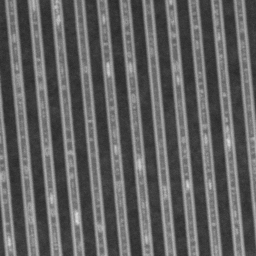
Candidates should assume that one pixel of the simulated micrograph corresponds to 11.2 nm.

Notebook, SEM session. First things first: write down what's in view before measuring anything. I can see parallel lines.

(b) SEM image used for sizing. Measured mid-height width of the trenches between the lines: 164 nm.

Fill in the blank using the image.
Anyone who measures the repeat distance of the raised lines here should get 256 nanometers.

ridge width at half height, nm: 97.9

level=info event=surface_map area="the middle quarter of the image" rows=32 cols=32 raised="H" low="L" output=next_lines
LLLLHHLLLLHHLLLLHHLLLHHLLLLHHLLL
HLLLHHLLLLHHLLLLHHLLLHHLLLLHHLLL
HLLLLHLLLLHHLLLLHHLLLHHLLLLHHLLL
HLLLLHLLLLHHLLLLHHLLLLHHLLLHHLLL
HLLLLHHLLLHHLLLLHHLLLLHHLLLLHHLL
HLLLLHHLLLHHLLLLHHLLLLHHLLLLHHLL
HLLLLHHLLLLHHLLLHHLLLLHHLLLLHHLL
HLLLLHHLLLLHHLLLHHLLLLHHLLLLHHLL
HLLLLHHLLLLHHLLLHHLLLLHHLLLLHHLL
HLLLLHHLLLLHHLLLHHLLLLHHLLLLHHLL
HLLLLHHLLLLHHLLLLHHLLLHHLLLLHHLL
HLLLLHHLLLLHHLLLLHHLLLLHLLLLHHLL
HHLLLHHLLLLHHLLLLHHLLLHHLLLLHHLL
HHLLLLHHLLLHHLLLLHHLLLHHLLLLHHLL
HHLLLLHHLLLHHLLLLHHLLLLHHLLLHHLL
HHLLLLHHLLLHHLLLLHHLLLLHHLLLLHHL
HHLLLLHHLLLHHLLLLHHLLLLHHLLLLHHL
HHLLLLHHLLLLHHLLLHHLLLLHHLLLLHHL
HHLLLLHHLLLLHHLLLHHLLLLHHLLLLHHL
HHLLLLHHLLLLHHLLLHHLLLLHHLLLLHHL
HHLLLLHHLLLLHHLLLHHLLLLHHLLLLHHL
HHLLLLHHLLLLHHLLLLHHLLLHHLLLLHHL
HHLLLLHHLLLLHHLLLLHHLLLLHLLLLHHL
LHHLLLHHLLLLHHLLLLHHLLLLHLLLLHHL
LHHLLLLHHLLLHHLLLLHHLLLLHLLLLHHL
LHHLLLLHHLLLHHLLLLHHLLLLHHLLLHHL
LHHLLLLHLLLLHHLLLLHHLLLLHHLLLLHH
LHHLLLLHHLLLHHLLLLHHLLLLHHLLLLHH
LHHLLLLHHLLLLHHLLLHHLLLLHHLLLLHH
LHHLLLLHHLLLLHHLLLHHLLLLHHLLLLHH
LHHLLLLHHLLLLHHLLLHHLLLLHHLLLLHH
LHHLLLLHHLLLLHHLLLHHLLLLHHLLLLHH